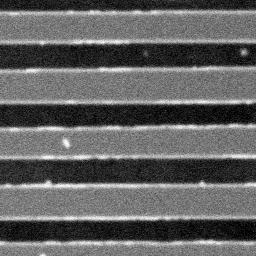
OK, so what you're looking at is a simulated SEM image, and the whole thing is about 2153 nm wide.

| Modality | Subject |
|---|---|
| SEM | lines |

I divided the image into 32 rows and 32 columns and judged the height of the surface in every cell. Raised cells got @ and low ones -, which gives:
--------------------------------
--------@--@@-@-@@@@@@@@@@@@@@@@
@@@@@@@@@@@@@@@@@@@@@@@@@@@@@@@@
@@@@@@@@@@@@@@@@@@@@@@@@@@@@@@@@
@@@@@@@@@@@@@@@@@@@@@@@@@@@@@@@@
--------------------------------
--------------------------------
--------------------------------
--------------------------------
@@@@@@@@@@@@@@@@@@@@@@@@@@@@@@@@
@@@@@@@@@@@@@@@@@@@@@@@@@@@@@@@@
@@@@@@@@@@@@@@@@@@@@@@@@@@@@@@@@
@@@@@@@@@@@@@@@@@@@@@@@@@@@@@@@@
--------------------------------
--------------------------------
--------------------------------
@@@@@@@@@@@@@@@@@@@@@@@@@@@@@@@@
@@@@@@@@@@@@@@@@@@@@@@@@@@@@@@@@
@@@@@@@@@@@@@@@@@@@@@@@@@@@@@@@@
@@@@@@@@@@@@@@@@@@@@@@@@@@@@@@@@
--------------------------------
--------------------------------
--------------------------------
@@@@@@@@@@@@@@@@@@@@@@@@@@@@@@@@
@@@@@@@@@@@@@@@@@@@@@@@@@@@@@@@@
@@@@@@@@@@@@@@@@@@@@@@@@@@@@@@@@
@@@@@@@@@@@@@@@@@@@@@@@@@@@@@@@@
--------------------------------
--------------------------------
--------------------------------
@@@@@@@@@@@@@@@@@@@@@@@@@@@@@@@@
@@@@@@@@@@@@@@@@@@@@@@@@@@@@@@@@